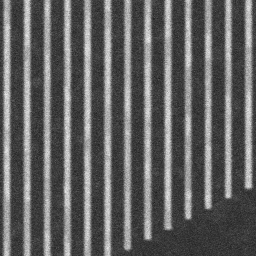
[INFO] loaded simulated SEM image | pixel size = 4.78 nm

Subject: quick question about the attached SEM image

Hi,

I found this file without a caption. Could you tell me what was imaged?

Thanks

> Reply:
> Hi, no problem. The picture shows parallel lines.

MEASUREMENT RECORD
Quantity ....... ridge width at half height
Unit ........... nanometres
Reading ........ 23.9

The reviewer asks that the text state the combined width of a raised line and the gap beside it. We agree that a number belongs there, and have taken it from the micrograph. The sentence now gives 96.2 nm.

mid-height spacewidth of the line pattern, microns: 0.0729